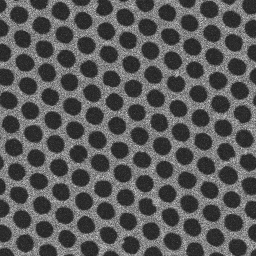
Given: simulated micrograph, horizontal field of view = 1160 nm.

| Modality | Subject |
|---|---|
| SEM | a regular array of holes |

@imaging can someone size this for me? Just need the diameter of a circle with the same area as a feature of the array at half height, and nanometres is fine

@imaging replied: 78.6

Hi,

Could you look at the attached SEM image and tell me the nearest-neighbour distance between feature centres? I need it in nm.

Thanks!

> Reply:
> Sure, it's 106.